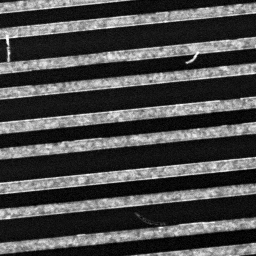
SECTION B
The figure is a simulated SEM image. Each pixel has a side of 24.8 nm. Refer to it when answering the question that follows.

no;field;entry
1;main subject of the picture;parallel lines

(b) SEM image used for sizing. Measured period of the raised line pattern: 754 nanometers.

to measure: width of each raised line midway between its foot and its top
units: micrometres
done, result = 0.256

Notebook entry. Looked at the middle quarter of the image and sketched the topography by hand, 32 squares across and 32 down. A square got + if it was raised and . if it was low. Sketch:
+...............................
................................
.......................+++++++++
.............+++++++++++++++++++
...++++++++++++++++++++++.......
+++++++++++++++.................
+++++...........................
................................
................................
................................
............................++++
..................++++++++++++++
........++++++++++++++++++++++++
++++++++++++++++++++++..........
++++++++++++....................
++..............................
................................
......................++++++++++
............++++++++++++++++++++
..++++++++++++++++++++++++......
++++++++++++++++................
++++++..........................
................................
................................
................................
...........................+++++
.................+++++++++++++++
.......+++++++++++++++++++++++++
+++++++++++++++++++++++.........
++++++++++++++..................
++++............................
................................